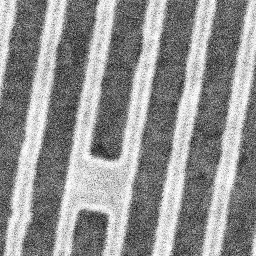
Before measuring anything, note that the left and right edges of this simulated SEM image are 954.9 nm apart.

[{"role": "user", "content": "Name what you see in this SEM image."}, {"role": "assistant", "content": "parallel lines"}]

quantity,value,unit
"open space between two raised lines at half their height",37.3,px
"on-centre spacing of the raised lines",183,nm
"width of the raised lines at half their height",42.2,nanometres